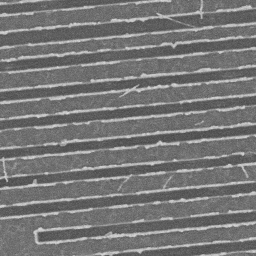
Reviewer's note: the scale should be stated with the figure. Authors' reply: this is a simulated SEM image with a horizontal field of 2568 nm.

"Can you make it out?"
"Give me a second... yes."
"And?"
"parallel lines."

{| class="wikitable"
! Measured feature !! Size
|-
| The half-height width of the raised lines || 0.191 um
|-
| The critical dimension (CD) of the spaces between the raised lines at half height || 104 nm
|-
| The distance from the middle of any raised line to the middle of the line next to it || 288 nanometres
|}